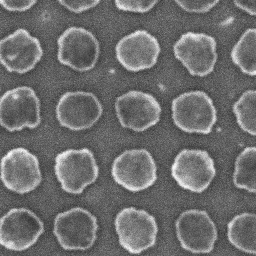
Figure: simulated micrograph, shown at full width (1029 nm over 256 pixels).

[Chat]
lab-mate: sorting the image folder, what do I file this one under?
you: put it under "a regular array of raised bodies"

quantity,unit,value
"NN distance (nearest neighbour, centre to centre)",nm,236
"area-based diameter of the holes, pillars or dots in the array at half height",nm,167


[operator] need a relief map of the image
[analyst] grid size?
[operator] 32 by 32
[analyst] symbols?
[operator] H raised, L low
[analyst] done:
HHHHLLLLHHHHLLLHHHHLLLHHHHHLLLHH
LLLLLLLLLHLLLLLLLLLLLLLLLLLLLLLH
LLLLLLLLLLLLLLLLLLLLLLLLLLLLLLLL
LLLLLLLLLLLLLLLLLLLLLLLLLLLLLLLL
LHHHLLLLHHHHLLLLHHHLLLLHHHLLLLHH
HHHHHLLHHHHHLLLHHHHHLLHHHHHLLLHH
HHHHHLLHHHHHLLLHHHHHLLHHHHHLLHHH
HHHHHLLLHHHHLLLHHHHLLLLHHHHLLHHH
LHHHLLLLLHHLLLLLHHLLLLLHHHHLLLHH
LLLLLLLLLLLLLLLLLLLLLLLLLLLLLLLL
LLLLLLLLLLLLLLLLLLLLLLLLLLLLLLLL
LHHHLLLLLLLLLLLLHLLLLLLLHLLLLLLH
HHHHHLLHHHHHLLLHHHHLLLHHHHLLLLHH
HHHHHLLHHHHHHLHHHHHHLLHHHHHLLHHH
HHHHHLLHHHHHLLLHHHHHLLHHHHHLLLHH
HHHHHLLLHHHHLLLHHHHLLLHHHHLLLLHH
LLLLLLLLLLLLLLLLLLLLLLLLLLLLLLLH
LLLLLLLLLLLLLLLLLLLLLLLLLLLLLLLL
LLLLLLLLLLLLLLLLLLLLLLLLLLLLLLLH
LHHHLLLHHHHLLLLHHHHLLLHHHHLLLLHH
HHHHHLLHHHHHLLHHHHHLLLHHHHHLLHHH
HHHHHLLHHHHHLLHHHHHLLLHHHHHLLHHH
HHHHHLLLHHHHLLLHHHHLLLHHHHLLLHHH
LHHHLLLLHHHLLLLLHHLLLLLHHHLLLLLH
LLLLLLLLLLLLLLLLLLLLLLLLLLLLLLLL
LLLLLLLLLLLLLLLLLLLLLLLLLLLLLLLL
LHHHLLLLHHHLLLLHHHLLLLLHHHLLLLLL
HHHHHLLHHHHHLLLHHHHLLLHHHHLLLHHH
HHHHHLLHHHHHLLLHHHHHLLHHHHHLLHHH
HHHHHLLHHHHHLLLHHHHLLLHHHHHLLHHH
LHHHLLLLHHHHLLLHHHHLLLLHHHHLLHHH
LLLLLLLLLLLLLLLLLLLLLLLLHLLLLLLH